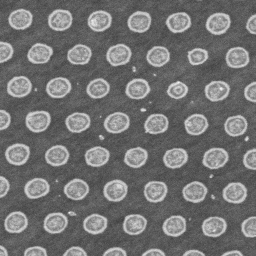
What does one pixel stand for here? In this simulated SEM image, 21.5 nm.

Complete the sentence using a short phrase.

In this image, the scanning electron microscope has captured a regular array of raised bodies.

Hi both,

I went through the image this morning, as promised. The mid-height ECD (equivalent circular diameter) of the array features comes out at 0.445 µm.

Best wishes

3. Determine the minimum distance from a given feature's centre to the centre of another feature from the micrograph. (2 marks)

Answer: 835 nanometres